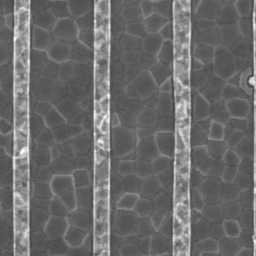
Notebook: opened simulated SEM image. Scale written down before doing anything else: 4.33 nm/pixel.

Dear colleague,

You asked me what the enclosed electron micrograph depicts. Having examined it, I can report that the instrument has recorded one or a few lines or trenches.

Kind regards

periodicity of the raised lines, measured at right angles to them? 0.347 microns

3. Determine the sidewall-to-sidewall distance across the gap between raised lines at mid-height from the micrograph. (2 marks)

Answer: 281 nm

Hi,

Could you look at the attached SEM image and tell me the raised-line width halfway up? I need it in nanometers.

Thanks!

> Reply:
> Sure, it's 62.8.